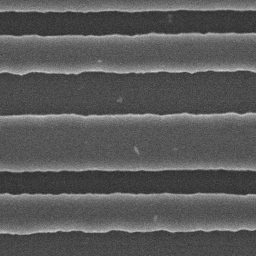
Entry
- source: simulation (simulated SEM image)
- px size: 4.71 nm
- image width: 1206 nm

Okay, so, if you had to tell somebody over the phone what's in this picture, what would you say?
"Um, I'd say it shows lines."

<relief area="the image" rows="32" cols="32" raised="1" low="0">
11111111111111111111111111111111
00000000000000000000000000000000
00000000000000000000000000000000
00000000000000000000000000000000
00001000000101110111111111111111
11111111111111111111111111111111
11111111111111111111111111111111
11111111111111111111111111111111
11111111111111111111111111111111
00000000000000000000000000000000
00000000000000000000000000000000
00000000000000000000000000000000
00000000000000000000000000000000
00000000000000000000000000000000
00000011110000001111111111111111
11111111111111111111111111111111
11111111111111111111111111111111
11111111111111111111111111111111
11111111111111111111111111111111
11111111111111111111111111111111
11111111111111111111111111111111
00000000000000000000000000000000
00000000000000000000000000000000
00000000000000000000000000000000
11111111111111111111111111111111
11111111111111111111111111111111
11111111111111111111111111111111
11111111111111111111111111111111
11111111111111111111111111111111
00000000000000000000000000000000
00000000000000000000000000000000
00000000000000000000000000000000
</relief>